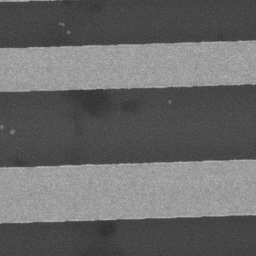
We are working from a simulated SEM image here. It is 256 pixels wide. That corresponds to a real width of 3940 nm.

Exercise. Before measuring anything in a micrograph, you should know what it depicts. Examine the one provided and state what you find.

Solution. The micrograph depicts lines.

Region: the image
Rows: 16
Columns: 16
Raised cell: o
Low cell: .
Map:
................
................
................
oooooooooooooooo
oooooooooooooooo
ooooooooo.......
................
................
................
................
oooooooooooooooo
oooooooooooooooo
oooooooooooooooo
ooooooooooooo...
................
................